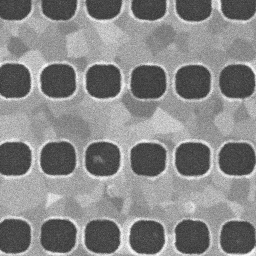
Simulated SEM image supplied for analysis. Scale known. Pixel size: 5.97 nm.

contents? a regular array of holes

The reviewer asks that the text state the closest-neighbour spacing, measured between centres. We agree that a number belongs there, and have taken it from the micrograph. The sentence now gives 267 nm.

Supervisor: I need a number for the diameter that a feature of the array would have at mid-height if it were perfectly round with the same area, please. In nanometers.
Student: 223